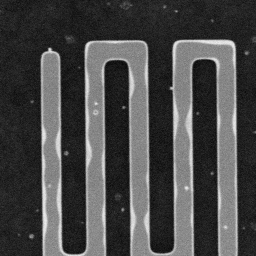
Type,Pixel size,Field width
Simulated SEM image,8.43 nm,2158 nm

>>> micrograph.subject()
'groups of lines, slits or small figures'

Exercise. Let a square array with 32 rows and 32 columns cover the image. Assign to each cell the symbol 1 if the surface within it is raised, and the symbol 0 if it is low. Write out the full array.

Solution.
00000000000000000000000000000000
00000000000000000000000000000000
00000000000000000000000000000000
00000000000000000000000000000000
00000000000000000000000000000000
00000000000111111100001111111000
00000000000111111100001111111000
00000110000111011100001110111000
00000110000110001100001100011000
00000110000110001100001100011000
00000111000110001100001100011000
00000111000110001100001100011000
00000111000110001100001100011000
00000111000110001100001100011000
00000111000110001100001100011000
00000111000110001100001100011000
00000111000110001110001100011000
00000110000110001110001100011000
00000110000110001110001100011000
00000111000110001110001100011000
00000111000110001110001100011000
00000111000110001110001100011000
00000111000110001110001100011000
00000111000110001110001100011100
00000110000110001110001100011100
00000110000110001110001100011100
00000111000110001110001100011100
00000011000110000100001100011100
00000011000110001110001100011100
00000111000110001110001100011100
00000111000110001110001100011100
00000111001110001110011100011100